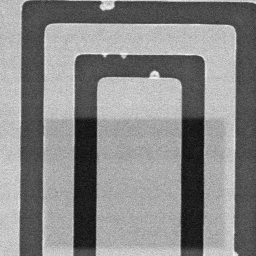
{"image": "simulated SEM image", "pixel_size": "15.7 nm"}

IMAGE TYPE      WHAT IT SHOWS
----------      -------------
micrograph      groups of lines, slits or small figures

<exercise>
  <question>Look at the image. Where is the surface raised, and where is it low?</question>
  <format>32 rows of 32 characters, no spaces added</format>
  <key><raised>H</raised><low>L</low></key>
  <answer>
HHHLLLLLLLLLLLLLLLLLLLLLLLLLLLLL
HHHLLLLLLLLLLLLLLLLLLLLLLLLLLLLL
HHHLLLLLLLLLLLLLLLLLLLLLLLLLLLLL
HHHLLLHHHHHHHHHHHHHHHHHHHHHHHLLL
HHHLLLHHHHHHHHHHHHHHHHHHHHHHHLLL
HHHLLLHHHHHHHHHHHHHHHHHHHHHHHLLL
HHHLLLHHHHHHHHHHHHHHHHHHHHHHHLLL
HHHLLLHHHLLLLLLLLLLLLLLLLHHHHLLL
HHHLLLHHHLLLLLLLLLLLLLLLLLHHHLLL
HHHLLLHHHLLLLLLLLLLLLLLLLLHHHLLL
HHHLLLHHHLLLHHHHHHHHHHHLLLHHHLLL
HHHLLLHHHLLLHHHHHHHHHHHLLLHHHLLL
HHHLLHHHHLLLHHHHHHHHHHHLLLHHHLLL
HHHLLHHHHLLLHHHHHHHHHHHLLLHHHLLL
HHHLLHHHHLLLHHHHHHHHHHHLLLHHHLLL
HHHLLHHHHLLLHHHHHHHHHHHLLLHHHLLL
HHHLLHHHHLLLHHHHHHHHHHHLLLHHHLLL
HHLLLHHHHLLLHHHHHHHHHHHLLLHHHLLL
HHLLLHHHHLLLHHHHHHHHHHHLLLHHHLLL
HHLLLHHHHLLLHHHHHHHHHHHLLLHHHLLL
HHLLLHHHHLLLHHHHHHHHHHHLLLHHHLLL
HHLLLHHHHLLLHHHHHHHHHHHLLLHHHLLL
HHLLLHHHHLLLHHHHHHHHHHHLLLHHHLLL
HHLLLHHHHLLLHHHHHHHHHHHLLLHHHLLL
HHLLLHHHHLLLHHHHHHHHHHHLLLHHHLLL
HHLLLHHHHLLLHHHHHHHHHHHLLLHHHLLL
HHLLLHHHHLLLHHHHHHHHHHHLLLHHHLLL
HHLLLHHHHLLLHHHHHHHHHHHLLLHHHLLL
HHLLLHHHHLLLHHHHHHHHHHHLLHHHHLLL
HHLLLHHHHLLLHHHHHHHHHHHLLHHHHLLL
HHLLLHHHHLLLHHHHHHHHHHHLLHHHHLLL
HHLLLHHHHLLLHHHHHHHHHHHLLHHHHLLL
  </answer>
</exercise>